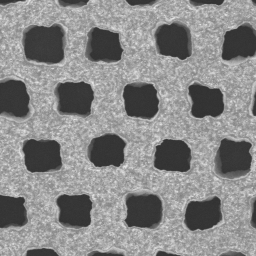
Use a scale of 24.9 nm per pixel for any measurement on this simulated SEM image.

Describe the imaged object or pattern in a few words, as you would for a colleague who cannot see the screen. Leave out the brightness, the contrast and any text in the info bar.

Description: a regular array of holes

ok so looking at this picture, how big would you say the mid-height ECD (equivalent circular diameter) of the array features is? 920 nm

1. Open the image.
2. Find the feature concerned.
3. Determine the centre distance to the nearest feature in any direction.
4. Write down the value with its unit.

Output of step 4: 1510 nm